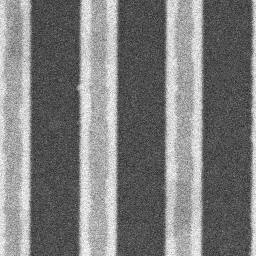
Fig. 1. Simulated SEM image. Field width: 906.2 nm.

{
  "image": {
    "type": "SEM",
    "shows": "one or a few lines or trenches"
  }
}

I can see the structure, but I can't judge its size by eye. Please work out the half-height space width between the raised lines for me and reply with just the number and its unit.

0.198 um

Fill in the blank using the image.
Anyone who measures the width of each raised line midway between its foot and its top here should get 103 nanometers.